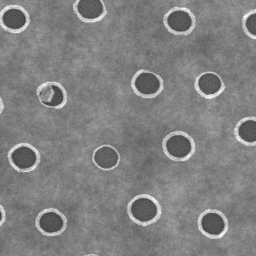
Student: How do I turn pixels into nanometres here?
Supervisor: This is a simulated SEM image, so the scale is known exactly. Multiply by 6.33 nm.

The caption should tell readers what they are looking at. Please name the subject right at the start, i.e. a regular array of holes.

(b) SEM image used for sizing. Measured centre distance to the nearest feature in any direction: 428 nanometers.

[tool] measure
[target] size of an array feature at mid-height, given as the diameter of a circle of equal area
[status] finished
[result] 150 nm